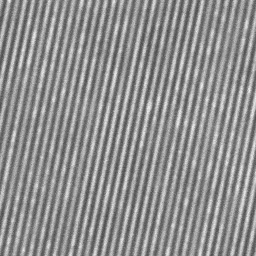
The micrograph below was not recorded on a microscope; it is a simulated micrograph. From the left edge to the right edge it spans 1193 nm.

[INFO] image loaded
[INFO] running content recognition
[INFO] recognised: parallel lines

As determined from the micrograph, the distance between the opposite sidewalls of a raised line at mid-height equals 12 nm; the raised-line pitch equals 36.9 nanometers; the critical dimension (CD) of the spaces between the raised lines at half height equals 0.028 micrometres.